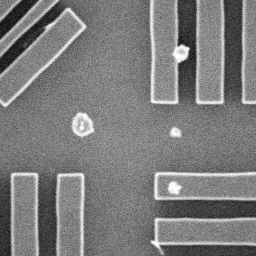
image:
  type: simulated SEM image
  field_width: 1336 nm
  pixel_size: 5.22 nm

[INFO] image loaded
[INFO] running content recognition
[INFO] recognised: groups of lines, slits or small figures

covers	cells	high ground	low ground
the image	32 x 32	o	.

oo..ooo............ooo...ooo..oo
o...oo..o..........ooo...ooo..oo
...oo..ooo.........ooo...ooo..oo
..oo..ooooo........ooo...ooo..oo
.oo..ooooo.........ooo...ooo..oo
oo..ooooo..........ooo...ooo..oo
o..ooooo...........oooo..ooo..oo
..ooooo............oooo..ooo..oo
.ooooo.............ooo...ooo..oo
ooooo..............ooo...ooo..oo
oooo...............ooo...ooo..oo
ooo................ooo...ooo..oo
oo.................ooo...ooo..oo
................................
................................
................................
................................
................................
................................
................................
................................
................................
.oooo..ooo.........ooooooooooooo
.oooo..ooo.........ooooooooooooo
.oooo..ooo.........ooooooooooooo
.oooo..ooo......................
.oooo..ooo......................
.oooo..ooo..........oooooooooooo
.oooo..ooo.........ooooooooooooo
.oooo..ooo.........ooooooooooooo
.oooo..ooo....................oo
.oooo..ooo......................